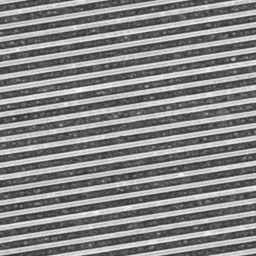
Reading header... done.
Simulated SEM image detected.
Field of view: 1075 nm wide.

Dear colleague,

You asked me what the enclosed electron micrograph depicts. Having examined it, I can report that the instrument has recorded parallel lines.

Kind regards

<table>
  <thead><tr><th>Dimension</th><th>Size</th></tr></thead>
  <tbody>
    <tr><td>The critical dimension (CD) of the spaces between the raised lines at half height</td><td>0.0353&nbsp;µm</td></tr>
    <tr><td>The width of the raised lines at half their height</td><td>17.6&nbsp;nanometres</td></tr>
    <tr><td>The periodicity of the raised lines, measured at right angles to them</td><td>0.052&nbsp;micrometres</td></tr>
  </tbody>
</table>